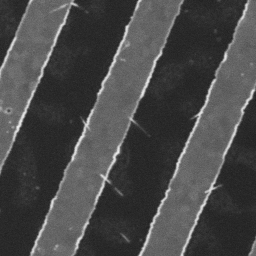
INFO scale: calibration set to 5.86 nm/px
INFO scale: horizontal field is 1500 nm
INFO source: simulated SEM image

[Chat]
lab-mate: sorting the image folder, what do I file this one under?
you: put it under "one or a few lines or trenches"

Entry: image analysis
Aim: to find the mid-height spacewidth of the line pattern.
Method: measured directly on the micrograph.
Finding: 348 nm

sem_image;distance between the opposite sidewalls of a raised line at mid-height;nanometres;239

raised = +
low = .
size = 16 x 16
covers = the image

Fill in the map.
..++....+++....+
.+++....+++....+
.+++....++....++
+++....+++....++
+++....+++....++
++....+++....+++
++....+++....++.
+....+++....+++.
+....+++....+++.
+....++....+++..
....+++....+++..
....+++....++...
...+++....+++...
...+++....++....
..+++....+++....
..+++....+++....